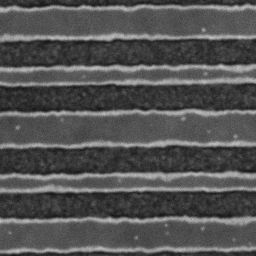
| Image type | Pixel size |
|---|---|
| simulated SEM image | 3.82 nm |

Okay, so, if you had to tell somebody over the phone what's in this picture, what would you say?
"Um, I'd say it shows lines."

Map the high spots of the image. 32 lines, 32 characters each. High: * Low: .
................................
********************************
********************************
********************************
********************************
................................
................................
................................
********************************
********************************
***********************.........
................................
................................
................................
********************************
********************************
********************************
********************************
****....**......................
................................
................................
.............................*..
********************************
********************************
................................
................................
................................
*****.**************************
********************************
********************************
********************************
***..*.**.........*.............